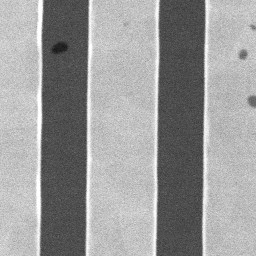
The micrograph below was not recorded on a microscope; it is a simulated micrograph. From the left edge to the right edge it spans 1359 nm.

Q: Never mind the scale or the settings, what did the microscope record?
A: wiring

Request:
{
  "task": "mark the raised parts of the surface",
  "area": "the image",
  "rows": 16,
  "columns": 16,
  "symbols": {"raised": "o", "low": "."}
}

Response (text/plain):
ooo...oooo...ooo
ooo...oooo...ooo
ooo...oooo...ooo
ooo...oooo...ooo
ooo...oooo...ooo
ooo...oooo...ooo
ooo...oooo...ooo
ooo...oooo...ooo
oo....oooo...ooo
oo....oooo...ooo
oo....oooo...ooo
oo....oooo...ooo
oo....oooo...ooo
oo....oooo...ooo
oo...ooooo...ooo
oo...ooooo...ooo